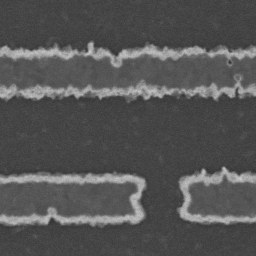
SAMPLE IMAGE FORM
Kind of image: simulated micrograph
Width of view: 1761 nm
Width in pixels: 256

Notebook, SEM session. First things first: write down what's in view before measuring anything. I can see one or a few lines or trenches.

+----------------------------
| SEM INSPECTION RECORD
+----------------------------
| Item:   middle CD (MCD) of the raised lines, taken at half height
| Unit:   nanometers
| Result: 272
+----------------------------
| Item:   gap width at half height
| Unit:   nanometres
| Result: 596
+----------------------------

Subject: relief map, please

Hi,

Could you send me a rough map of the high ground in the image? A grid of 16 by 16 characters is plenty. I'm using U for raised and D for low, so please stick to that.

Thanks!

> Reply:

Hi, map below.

DDDDDDDDDDDDDDDD
DDDDDDDDDDDDDDDD
DDDDDDDDDDDDDDDD
UUUUUUUDUUUUUUUU
UUUUUUUUUUUUUUUU
UUUUUUUUUUUUUUUU
DDDDDDDDDDDDDDDD
DDDDDDDDDDDDDDDD
DDDDDDDDDDDDDDDD
DDDDDDDDDDDDDDDD
DDDDDDDDDDDDDDDD
UUUUUUUUUDDDUUUU
UUUUUUUUDDDDUUUU
UUUUUUUUDDDDUUUU
DDDDDDDDDDDDDDDD
DDDDDDDDDDDDDDDD